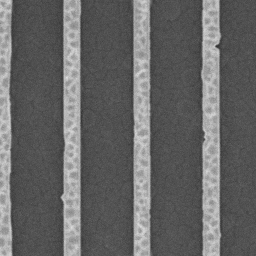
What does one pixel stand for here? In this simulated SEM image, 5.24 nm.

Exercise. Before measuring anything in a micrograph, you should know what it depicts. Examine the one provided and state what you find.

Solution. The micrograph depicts one or a few lines or trenches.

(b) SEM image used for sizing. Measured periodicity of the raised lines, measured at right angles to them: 365 nm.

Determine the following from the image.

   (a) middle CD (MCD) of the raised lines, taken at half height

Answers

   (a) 81.6 nanometres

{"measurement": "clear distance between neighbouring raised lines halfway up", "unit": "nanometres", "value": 284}